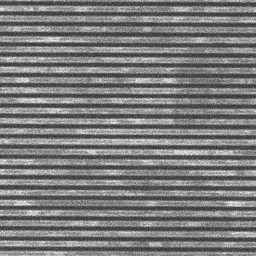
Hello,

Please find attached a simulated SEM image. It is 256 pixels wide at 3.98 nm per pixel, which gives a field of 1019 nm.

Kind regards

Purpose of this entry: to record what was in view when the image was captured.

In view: parallel lines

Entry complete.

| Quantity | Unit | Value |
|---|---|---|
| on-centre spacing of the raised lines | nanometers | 40.7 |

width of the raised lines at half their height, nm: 19.4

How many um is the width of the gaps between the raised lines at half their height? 0.0194